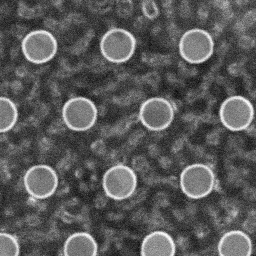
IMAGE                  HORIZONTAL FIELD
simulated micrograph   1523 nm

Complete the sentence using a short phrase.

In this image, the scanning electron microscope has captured a regular array of raised bodies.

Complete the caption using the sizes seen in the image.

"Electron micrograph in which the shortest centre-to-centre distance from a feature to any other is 464 nanometres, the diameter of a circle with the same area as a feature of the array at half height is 189 nm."